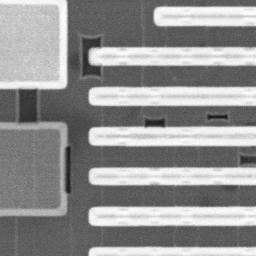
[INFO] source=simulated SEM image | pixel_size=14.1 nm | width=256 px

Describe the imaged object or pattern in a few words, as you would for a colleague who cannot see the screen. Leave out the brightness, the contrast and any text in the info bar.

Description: wiring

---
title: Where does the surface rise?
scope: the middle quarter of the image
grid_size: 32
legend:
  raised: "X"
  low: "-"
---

--------------------------------
--------------------------------
--------------------------------
--------------------------------
--------------------------------
--------------------------------
--------------------------------
-------XXXXXXXXXXXXXXXXXXXXXXXXX
-------XXXXXXXXXXXXXXXXXXXXXXXXX
--------------------------------
--------------------------------
--------------------------------
--------------------------------
--------------------------------
--------------------------------
--------------------------------
--------------------------------
-------XXXXXXXXXXXXXXXXXXXXXXXXX
-------XXXXXXXXXXXXXXXXXXXXXXXXX
--------XXXXX---XXXXXXXXXXXX----
--------------------------------
--------------------------------
--------------------------------
--------------------------------
--------------------------------
--------------------------------
--------------------------------
-------XXXXXXXXXXXXXXXXXXXXXXXXX
-------XXXXXXXXXXXXXXXXXXXXXXXXX
--------------------------------
--------------------------------
--------------------------------